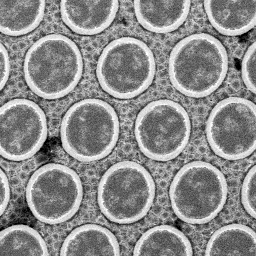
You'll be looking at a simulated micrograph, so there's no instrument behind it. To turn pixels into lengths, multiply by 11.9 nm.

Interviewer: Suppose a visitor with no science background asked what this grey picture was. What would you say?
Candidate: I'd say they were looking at a regular array of raised bodies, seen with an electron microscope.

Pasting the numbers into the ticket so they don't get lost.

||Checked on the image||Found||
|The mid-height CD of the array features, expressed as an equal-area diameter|0.653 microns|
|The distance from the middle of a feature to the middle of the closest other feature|0.855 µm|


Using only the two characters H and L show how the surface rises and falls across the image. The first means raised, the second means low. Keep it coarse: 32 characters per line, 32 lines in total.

HHHHHLLLHHHHHHLLLHHHHHHLLLHHHHHH
HHHHHLLLHHHHHHLLLHHHHHHLLLHHHHHH
HHHHHLLLHHHHHHLLLLHHHHHLLLHHHHHH
HHHHLLLLLHHHHLLLLLLHHLLLLLLHHHHL
LLLLLLLLLLLLLLLLLLLLLLLLLLLLLLLL
LLLLLHHHHLLLLLHHHLLLLLLHHHHLLLLL
HLLLHHHHHHLLLHHHHHHLLLHHHHHHLLLH
HLLHHHHHHHLLLHHHHHHLLHHHHHHHLLLH
HLLHHHHHHHLLHHHHHHHLLHHHHHHHLLLH
HLLHHHHHHHLLLHHHHHHLLLHHHHHHLLLH
LLLLHHHHHLLLLHHHHHLLLLHHHHHLLLLH
LLLLLHHHLLLLLLHHHLLLLLLHHHLLLLLL
LLLLLLLLLLLLLLLLLLLLLLLLLLLLLHLL
LHHHHLLLLHHHHHLLLLLHHHLLLLLHHHHH
HHHHHLLLHHHHHHLLLLHHHHHLLLLHHHHH
HHHHHLLLHHHHHHHLLHHHHHHLLLHHHHHH
HHHHHLLLHHHHHHHLLHHHHHHLLLHHHHHH
HHHHHLLLHHHHHHLLLHHHHHHLLLHHHHHH
HHHHHLLLHHHHHHLLLLHHHHHLLLLHHHHH
LHHLLLLLLLHHHLLLLLLHHLLLLLLLHHLL
LLLLLLLLLLLLLLLLLLLLLLLLLLLLLLLL
LLLLLHHHHLLLLLHHHHLLLLLHHHHLLLLH
HLLLHHHHHHLLLHHHHHHLLLHHHHHHLLLH
HLLLHHHHHHLLLHHHHHHLLLHHHHHHLLLH
HLLLHHHHHHLLLHHHHHHLLLHHHHHHLLLH
HLLLHHHHHHLLLHHHHHHLLLHHHHHHLLLH
LLLLHHHHHLLLLHHHHHLLLLHHHHHLLLLH
LLLLLHHHLLLLLLLHLLLLLLLHHLLLLLLL
LLHLLLLLLLLHLLLLLLLLHLLLLLLLHHLL
HHHHHLLLLHHHHHLLLLHHHHHLLLLHHHHH
HHHHHLLLHHHHHHLLLHHHHHHLLLHHHHHH
HHHHHHLLHHHHHHLLLHHHHHHHLLHHHHHH